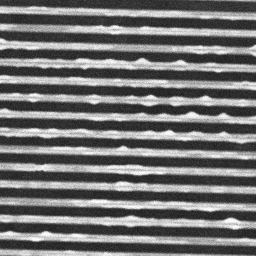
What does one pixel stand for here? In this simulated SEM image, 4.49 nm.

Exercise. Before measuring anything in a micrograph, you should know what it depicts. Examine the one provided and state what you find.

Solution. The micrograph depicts parallel lines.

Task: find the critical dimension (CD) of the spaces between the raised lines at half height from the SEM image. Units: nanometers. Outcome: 46.6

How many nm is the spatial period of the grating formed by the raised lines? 78.1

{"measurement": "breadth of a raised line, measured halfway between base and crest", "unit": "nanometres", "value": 29.7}